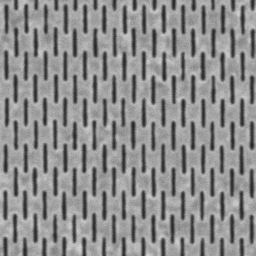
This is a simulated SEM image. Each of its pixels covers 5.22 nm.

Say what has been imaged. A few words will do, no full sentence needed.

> a regular array of holes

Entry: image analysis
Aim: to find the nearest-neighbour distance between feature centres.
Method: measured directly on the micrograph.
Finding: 0.102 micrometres